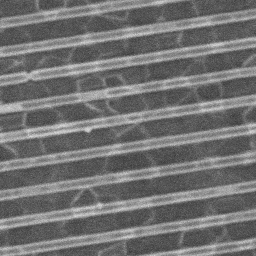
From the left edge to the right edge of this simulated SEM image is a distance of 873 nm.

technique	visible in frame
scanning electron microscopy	parallel lines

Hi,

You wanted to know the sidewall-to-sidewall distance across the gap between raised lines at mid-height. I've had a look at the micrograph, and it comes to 0.0684 um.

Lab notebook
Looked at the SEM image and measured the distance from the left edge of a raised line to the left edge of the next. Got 97 nanometres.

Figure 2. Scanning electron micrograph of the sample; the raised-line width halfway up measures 30.8 nm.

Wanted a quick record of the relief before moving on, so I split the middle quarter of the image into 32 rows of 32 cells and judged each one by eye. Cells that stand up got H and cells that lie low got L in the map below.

LHHHHHHHHHHHHHHLLLLLLLLLLLLLLLLL
HHHHHHHHLLLLLLLLLLLLLLLLLLLLLLLL
HHLLLLLLLLLLLLLLLLLLLLLLLLLLLLLL
LLLLLLLLLLLLLLLLLLLLLLLLLLLLLLHH
LLLLLLLLLLLLLLLLLLLLLLLHHHHHHHHH
LLLLLLLLLLLLLLLLHHHHHHHHHHHHHLLL
LLLLLLLLLLHHHHHHHHHHHHHLLLLLLLLL
LLLHHHHHHHHHHHHHLLLLLLLLLLLLLLLL
HHHHHHHHHLLLLLLLLLLLLLLLLLLLLLLL
HHHLLLLLLLLLLLLLLLLLLLLLLLLLLLLL
LLLLLLLLLLLLLLLLLLLLLLLLLLLLLLLH
LLLLLLLLLLLLLLLLLLLLLLLLHHHHHHHH
LLLLLLLLLLLLLLLLLHHHHHHHHHHHHHLL
LLLLLLLLLLLHHHHHHHHHHHHHLLLLLLLL
LLLLHHHHHHHHHHHHHLLLLLLLLLLLLLLL
HHHHHHHHHHLLLLLLLLLLLLLLLLLLLLLL
HHHHLHHLLLLLLLLLLLLLLLLLLLLLLLLL
LLLLLLLLLLLLLLLLLLLLLLLLLLLLLLLL
LLLLLLLLLLLLLLLLLLLLLLLLLHHHHHHH
LLLLLLLLLLLLLLLLLLHHHHHHHHHHHHHH
LLLLLLLLLLLLHHHHHHHHHHHHHHLLLLLL
LLLLLHHHHHHHHHHHHHHLLLLLLLLLLLLL
HHHHHHHHHHHHHLLLLLLLLLLLLLLLLLLL
HHHHHHLLLLLLLLLLLLLLLLLLLLLLLLLL
LLLLLLLLLLLLLLLLLLLLLLLLLLLLLLLL
LLLLLLLLLLLLLLLLLLLLLLLLLLHHHHHH
LLLLLLLLLLLLLLLLLLLHHHHHHHHHHHHH
LLLLLLLLLLLLLHHHHHHHHHHHHHHLLLLL
LLLLLLHHHHHHHHHHHHHHLLLLLLLLLLLL
HHHHHHHHHHHHHHLLLLLLLLLLLLLLLLLL
HHHHHHHLLLLLLLLLLLLLLLLLLLLLLLLL
HLLLLLLLLLLLLLLLLLLLLLLLLLLLLLLL